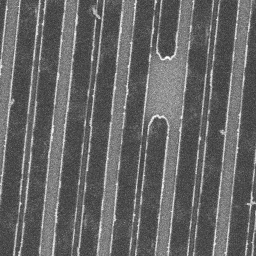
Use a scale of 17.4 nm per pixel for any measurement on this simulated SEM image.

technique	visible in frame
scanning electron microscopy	parallel lines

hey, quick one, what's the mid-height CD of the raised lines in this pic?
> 357 nanometers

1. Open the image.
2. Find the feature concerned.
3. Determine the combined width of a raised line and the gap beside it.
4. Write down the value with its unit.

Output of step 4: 500 nanometres